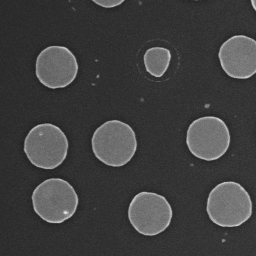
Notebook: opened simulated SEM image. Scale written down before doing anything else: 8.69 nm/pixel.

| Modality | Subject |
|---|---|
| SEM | raised bodies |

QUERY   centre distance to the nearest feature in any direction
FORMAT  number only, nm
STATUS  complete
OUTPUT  607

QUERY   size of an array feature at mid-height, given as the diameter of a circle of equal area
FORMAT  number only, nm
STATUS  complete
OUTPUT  382